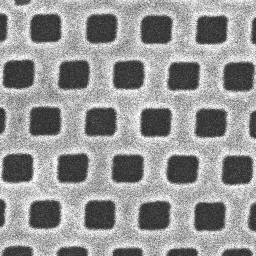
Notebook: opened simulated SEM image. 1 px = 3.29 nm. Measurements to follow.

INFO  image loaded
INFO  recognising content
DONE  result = a regular array of holes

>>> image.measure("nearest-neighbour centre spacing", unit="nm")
177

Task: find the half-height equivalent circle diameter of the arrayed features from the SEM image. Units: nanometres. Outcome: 107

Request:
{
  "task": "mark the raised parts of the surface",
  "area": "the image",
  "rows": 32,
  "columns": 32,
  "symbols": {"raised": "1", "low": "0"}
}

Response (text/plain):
11011111111111111111111111111111
11111111111111111111111111111111
01110000111000011100011110001111
01110000111000011100011110001110
01110000111000111100011100001110
11111111111111111101111110011111
11111111111111111111111111111111
11111111111111111111111111111111
10001111000111000011100001110000
00001110000111000011100001110000
00001110000111000011100001110000
11111111111111111111111111111111
11111111111111111111111111111111
11111001111100111111111111111111
01110000111000011100011110001110
01110000111000011000011100001110
11110001111000111100011100001110
11111111111111111111111111111111
11111111111111111111111111111111
10001111000111000111110011110001
00001110000111000011100001110000
00001110000111000011100001110000
00001110001111000011100011110001
11111111111111111111111111111111
11111111111111111111111111111111
01110001111000111100011110001111
01110000111000111000011100001110
01110000111000111000011100001110
11110001111000111100011100001110
11111111111111111111111111111111
11111111111111111111111111111111
00001110000111000011100001110001